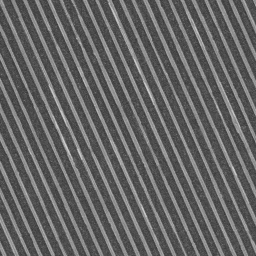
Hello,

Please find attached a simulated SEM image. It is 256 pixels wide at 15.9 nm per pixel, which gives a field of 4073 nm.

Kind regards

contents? parallel lines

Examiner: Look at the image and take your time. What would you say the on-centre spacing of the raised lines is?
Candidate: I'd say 176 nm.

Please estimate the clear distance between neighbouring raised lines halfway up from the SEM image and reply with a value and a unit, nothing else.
0.135 µm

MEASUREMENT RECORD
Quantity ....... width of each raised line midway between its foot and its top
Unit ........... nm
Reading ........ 40